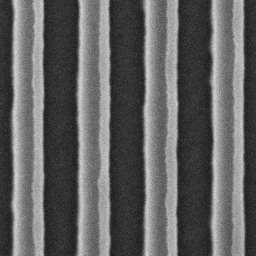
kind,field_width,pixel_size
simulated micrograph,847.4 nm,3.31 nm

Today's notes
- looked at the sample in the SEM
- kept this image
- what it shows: lines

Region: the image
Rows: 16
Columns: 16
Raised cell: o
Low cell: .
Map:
.oo..oo..oo..oo.
.oo..oo..oo..oo.
.oo..oo..oo..oo.
.oo..oo..oo..oo.
.oo..oo..oo..oo.
.oo..oo..oo..oo.
.oo..oo..oo..oo.
.oo..oo..oo..oo.
.oo..oo..oo..oo.
.oo..oo..oo..oo.
.oo..oo..oo..oo.
.oo..oo..oo..oo.
.oo..oo..oo..oo.
.oo..oo..oo..oo.
.oo..oo..oo..oo.
.oo..oo..oo..oo.